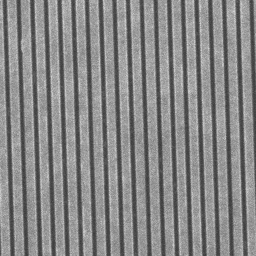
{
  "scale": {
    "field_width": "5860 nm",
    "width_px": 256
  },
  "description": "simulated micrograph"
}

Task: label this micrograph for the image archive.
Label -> parallel lines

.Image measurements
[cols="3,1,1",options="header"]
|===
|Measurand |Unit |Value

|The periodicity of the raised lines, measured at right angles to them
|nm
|313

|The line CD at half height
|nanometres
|194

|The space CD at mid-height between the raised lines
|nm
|109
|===